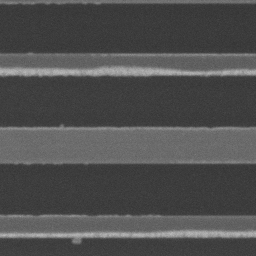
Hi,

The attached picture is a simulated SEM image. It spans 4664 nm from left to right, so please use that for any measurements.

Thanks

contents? lines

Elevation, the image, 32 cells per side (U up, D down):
DDDDDDDDDDDDDDDDDDDDDDDDDDDDDDDD
DDDDDDDDDDDDDDDDDDDDDDDDDDDDDDDD
DDDDDDDDDDDDDDDDDDDDDDDDDDDDDDDD
DDDDDDDDDDDDDDDDDDDDDDDDDDDDDDDD
DDDDDDDDDDDDDDDDDDDDDDDDDDDDDDDD
DDDDDDDDDDDDDDDDDDDDDDDDDDDDDDDD
DDDDDDDDDDDDDDDDDDDDDDDDDDDDDDDD
UUUUUUUUUUUUUUUUUUUUUUUUUUUUUUUU
UUUUUUUUUUUUUUUUUUUUUUUUUUUUUUUU
DDDDDDDDDDDDDDDDDDDDDDDDDDDDDDDD
DDDDDDDDDDDDDDDDDDDDDDDDDDDDDDDD
DDDDDDDDDDDDDDDDDDDDDDDDDDDDDDDD
DDDDDDDDDDDDDDDDDDDDDDDDDDDDDDDD
DDDDDDDDDDDDDDDDDDDDDDDDDDDDDDDD
DDDDDDDDDDDDDDDDDDDDDDDDDDDDDDDD
DDDDDDDDDDDDDDDDDDDDDDDDDDDDDDDD
UUUUUUUUUUUUUUUUUUUUUUUUUUUUUUUU
UUUUUUUUUUUUUUUUUUUUUUUUUUUUUUUU
UUUUUUUUUUUUUUUUUUUUUUUUUUUUUUUU
UUUUUUUUUUUUUUUUUUUUUUUUUUUUUUUU
DDDDDDDDDDDDDDDDDDDDDDDDDDDDDDDD
DDDDDDDDDDDDDDDDDDDDDDDDDDDDDDDD
DDDDDDDDDDDDDDDDDDDDDDDDDDDDDDDD
DDDDDDDDDDDDDDDDDDDDDDDDDDDDDDDD
DDDDDDDDDDDDDDDDDDDDDDDDDDDDDDDD
DDDDDDDDDDDDDDDDDDDDDDDDDDDDDDDD
DDDDDDDDDDDDDDDDDDDDDDDDDDDDDDDD
UUUUUUUUUUUUUUUUUUUUUUUUUUUUUUUU
UUUUUUUUUUUUUUUUUUUUUUUUUUUUUUUU
UUUUUUUUUUUUUUUUUUUUUDDDDDDDUDDD
DDDDDDDDDDDDDDDDDDDDDDDDDDDDDDDD
DDDDDDDDDDDDDDDDDDDDDDDDDDDDDDDD